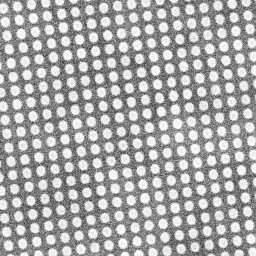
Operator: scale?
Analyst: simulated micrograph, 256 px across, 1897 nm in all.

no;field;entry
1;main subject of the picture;a regular array of raised bodies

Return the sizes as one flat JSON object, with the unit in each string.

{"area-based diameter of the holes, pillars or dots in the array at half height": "63.7 nanometers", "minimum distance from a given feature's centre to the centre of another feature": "102 nm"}